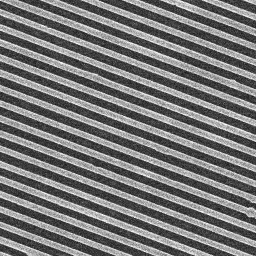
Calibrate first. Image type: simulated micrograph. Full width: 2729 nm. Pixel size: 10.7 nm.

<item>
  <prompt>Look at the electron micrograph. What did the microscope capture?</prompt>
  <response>parallel lines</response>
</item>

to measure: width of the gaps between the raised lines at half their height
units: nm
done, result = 82.4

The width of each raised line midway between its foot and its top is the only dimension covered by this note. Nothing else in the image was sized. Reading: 62.4 nanometres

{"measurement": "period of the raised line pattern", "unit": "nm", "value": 152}